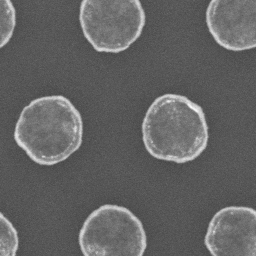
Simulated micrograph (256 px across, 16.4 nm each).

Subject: raised bodies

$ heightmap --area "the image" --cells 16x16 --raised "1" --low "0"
1000011110000111
1000011110000111
0000001100000011
0000000000000000
0000000000000000
0000000000000000
0011000000110000
0111100001111000
0111100001111000
0011100001110000
0000000000000000
0000000000000000
0000000000000000
0000001100000111
1000011110000111
1000011110000111